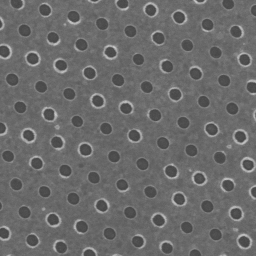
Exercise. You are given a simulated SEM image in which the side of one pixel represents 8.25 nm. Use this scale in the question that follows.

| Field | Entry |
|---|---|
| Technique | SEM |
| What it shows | a regular array of holes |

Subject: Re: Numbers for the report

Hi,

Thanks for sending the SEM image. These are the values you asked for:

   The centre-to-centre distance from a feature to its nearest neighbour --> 238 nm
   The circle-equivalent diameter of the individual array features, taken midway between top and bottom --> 98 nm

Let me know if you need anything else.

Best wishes